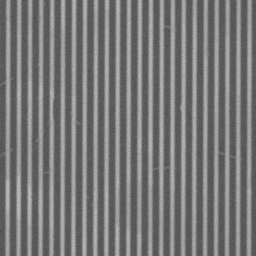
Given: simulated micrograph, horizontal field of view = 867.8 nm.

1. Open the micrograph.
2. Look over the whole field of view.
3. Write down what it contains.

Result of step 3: parallel lines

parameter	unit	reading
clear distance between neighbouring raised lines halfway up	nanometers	25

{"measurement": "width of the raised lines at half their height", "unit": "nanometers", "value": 12.3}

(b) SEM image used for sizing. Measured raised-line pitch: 0.0372 micrometres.